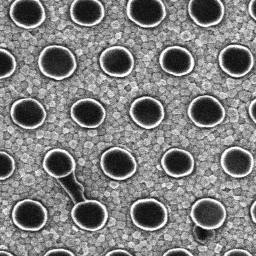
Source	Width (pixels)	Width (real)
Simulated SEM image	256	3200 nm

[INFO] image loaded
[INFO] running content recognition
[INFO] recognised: a regular array of raised bodies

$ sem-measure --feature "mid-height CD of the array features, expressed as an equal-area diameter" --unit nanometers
397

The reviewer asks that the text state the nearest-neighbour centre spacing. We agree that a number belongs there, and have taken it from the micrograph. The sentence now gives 735 nm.